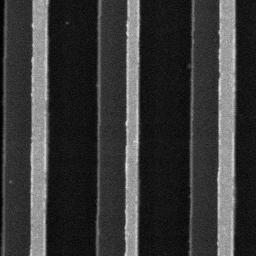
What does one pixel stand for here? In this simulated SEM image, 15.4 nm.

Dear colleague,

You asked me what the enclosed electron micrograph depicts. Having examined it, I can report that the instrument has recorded lines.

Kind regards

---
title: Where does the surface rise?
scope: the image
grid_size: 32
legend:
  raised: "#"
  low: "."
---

.#####......#####.......#####...
.#####......#####.......#####...
.#####......#####.......#####...
.#####......#####.......#####...
.#####......#####.......#####...
.#####......#####.......#####...
.#####......#####.......#####...
.#####......#####.......#####...
.#####......#####.......#####...
.#####......#####.......#####...
.#####......#####.......#####...
.#####......#####.......#####...
.#####......#####.......#####...
.#####......#####.......#####...
.#####......#####.......#####...
.#####......#####.......#####...
.#####......#####.......#####...
.#####......#####.......#####...
.#####......#####.......#####...
.#####......#####.......#####...
.#####......#####.......#####...
.#####......#####.......#####...
.#####......#####.......#####...
.#####......#####.......#####...
.#####......#####.......#####...
.#####......#####.......#####...
.#####......#####.......#####...
.#####......#####.......#####...
.#####......#####.......#####...
######......#####.......#####...
.#####......#####.......#####...
######......#####.......#####...